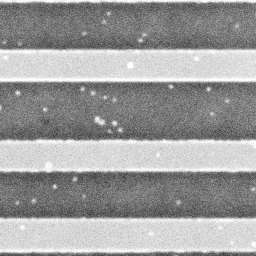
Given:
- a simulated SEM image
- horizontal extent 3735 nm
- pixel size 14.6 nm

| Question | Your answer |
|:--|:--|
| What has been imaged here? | lines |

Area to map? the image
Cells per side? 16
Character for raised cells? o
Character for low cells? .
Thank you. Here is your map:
................
................
................
oooooooooooooooo
oooooooooooooooo
................
................
................
................
oooooooooooooooo
oooooooooooooooo
................
................
................
oooooooooooooooo
oooooooooooooooo